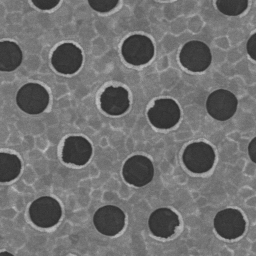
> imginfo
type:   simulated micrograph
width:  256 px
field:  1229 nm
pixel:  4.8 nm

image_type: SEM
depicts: a regular array of holes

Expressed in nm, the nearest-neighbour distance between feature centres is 265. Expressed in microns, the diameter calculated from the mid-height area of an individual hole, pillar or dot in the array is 0.153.